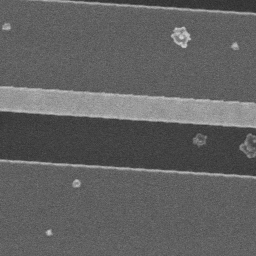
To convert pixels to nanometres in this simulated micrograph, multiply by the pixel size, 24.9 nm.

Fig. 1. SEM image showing lines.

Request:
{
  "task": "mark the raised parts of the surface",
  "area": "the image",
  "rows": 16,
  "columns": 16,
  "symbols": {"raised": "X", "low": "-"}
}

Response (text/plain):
XXXXXXXXXXX-----
XXXXXXXXXXXXXXXX
XXXXXXXXXXXXXXXX
XXXXXXXXXXXXXXXX
XXXXXXXXXXXXXXXX
XXXXXXXXXXXXXXXX
XXXXXXXXXXXXXXXX
---------XXXXXXX
----------------
----------------
XXXXXXXX--------
XXXXXXXXXXXXXXXX
XXXXXXXXXXXXXXXX
XXXXXXXXXXXXXXXX
XXXXXXXXXXXXXXXX
XXXXXXXXXXXXXXXX